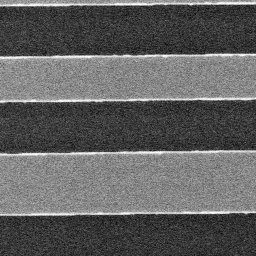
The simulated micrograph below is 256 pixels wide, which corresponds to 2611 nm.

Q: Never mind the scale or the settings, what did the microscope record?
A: lines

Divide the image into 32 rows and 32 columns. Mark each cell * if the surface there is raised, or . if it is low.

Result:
*****************.*.............
................................
................................
................................
................................
................................
................................
********************************
********************************
********************************
********************************
********************************
*****************...............
................................
................................
................................
................................
................................
................................
********************************
********************************
********************************
********************************
********************************
********************************
********************************
********************************
................................
................................
................................
................................
................................